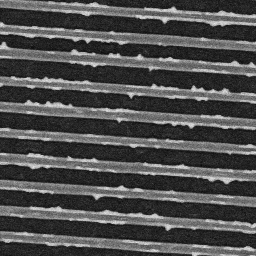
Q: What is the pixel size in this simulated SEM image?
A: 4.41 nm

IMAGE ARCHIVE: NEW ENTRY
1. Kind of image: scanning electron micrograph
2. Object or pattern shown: parallel lines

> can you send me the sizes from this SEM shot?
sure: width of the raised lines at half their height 46.7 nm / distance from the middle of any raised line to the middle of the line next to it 114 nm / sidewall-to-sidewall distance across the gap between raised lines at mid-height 68.7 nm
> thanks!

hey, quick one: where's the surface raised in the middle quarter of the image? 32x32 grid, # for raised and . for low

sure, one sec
.......#.......#################
.............................###
................................
................................
#######.........................
##################....###.......
...#############################
...............#################
..........................##.##.
................................
##..............................
################................
###########################.....
..........######################
....................############
...............................#
................................
#...............................
################................
.....###########################
................################
................................
................................
.#..............................
###########.....................
##########################.####.
......##########################
...................#############
................................
................................
###...........#.................
#####################...........